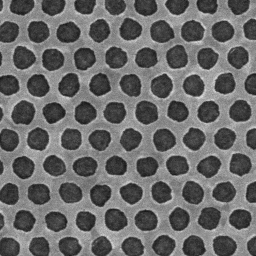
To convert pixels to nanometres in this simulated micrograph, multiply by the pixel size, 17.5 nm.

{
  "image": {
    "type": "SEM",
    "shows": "a regular array of holes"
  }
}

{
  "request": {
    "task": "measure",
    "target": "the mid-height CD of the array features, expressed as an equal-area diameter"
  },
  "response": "0.397 µm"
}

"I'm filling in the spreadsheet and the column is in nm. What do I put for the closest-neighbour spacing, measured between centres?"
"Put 523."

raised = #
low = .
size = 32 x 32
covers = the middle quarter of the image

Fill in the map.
###....####....####...####.....#
####.###########################
#..#####..##############..######
....###....###.....####....####.
....##.....###.....###.....###..
....##......##......##.....##...
....##......##.....###.....###..
...####....####....###.....###..
########################..######
####..######.######...#####...##
###....####....###.....###....##
###.....##......##.....###.....#
###.....##......##......##.....#
###.....##.....###......##.....#
###....####...#####....#####..##
################################
....####..#####...#####...#####.
....###....###.....###.....###..
....##......##......##......##..
.....#......##.....###......##..
....###....###.....####.....##..
#..#####..#####..######...#####.
################################
####...####...#####...####.....#
##......##......##.....###.....#
##......##......##......##.....#
.#......##......##.....###.....#
###....####....####....####....#
################################
#.#####################..######.
....###....####....###....####..
....###.....##......##.....##...